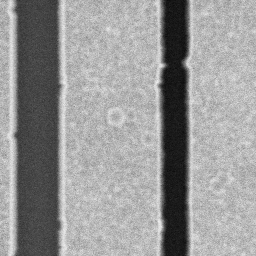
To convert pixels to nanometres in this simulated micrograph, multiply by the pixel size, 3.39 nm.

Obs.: one or a few lines or trenches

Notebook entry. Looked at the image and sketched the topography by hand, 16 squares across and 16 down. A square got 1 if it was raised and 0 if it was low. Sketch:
1000111111001111
1000111111001111
1000111111001111
1000111111001111
1000111111001111
1000111111001111
1000111111001111
1000111111001111
1000111111001111
1000111111001111
1000111111001111
1000111111001111
1000111111001111
1000111111001111
1000111111001111
1000111111001111